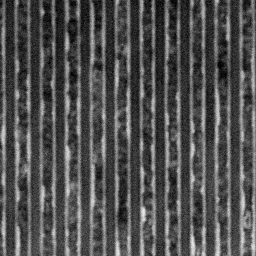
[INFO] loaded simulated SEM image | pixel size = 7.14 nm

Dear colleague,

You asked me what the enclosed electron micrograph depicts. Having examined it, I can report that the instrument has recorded parallel lines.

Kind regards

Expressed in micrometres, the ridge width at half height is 0.0928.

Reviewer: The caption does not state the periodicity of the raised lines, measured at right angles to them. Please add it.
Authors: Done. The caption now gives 178 nanometres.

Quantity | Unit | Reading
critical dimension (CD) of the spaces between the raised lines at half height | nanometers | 85.6